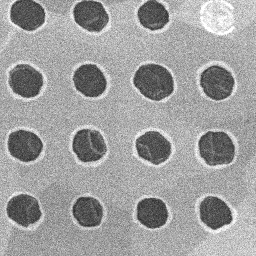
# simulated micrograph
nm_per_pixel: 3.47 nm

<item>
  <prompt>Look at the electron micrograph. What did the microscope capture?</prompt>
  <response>a regular array of holes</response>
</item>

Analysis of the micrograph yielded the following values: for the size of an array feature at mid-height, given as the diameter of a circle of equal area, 124 nanometres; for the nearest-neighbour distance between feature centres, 220 nanometres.